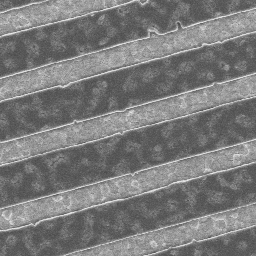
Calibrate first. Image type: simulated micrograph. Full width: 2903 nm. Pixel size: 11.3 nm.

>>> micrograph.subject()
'one or a few lines or trenches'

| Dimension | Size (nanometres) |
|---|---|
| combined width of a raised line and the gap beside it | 709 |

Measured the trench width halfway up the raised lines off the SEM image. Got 243 nanometres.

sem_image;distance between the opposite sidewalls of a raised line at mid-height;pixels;40.4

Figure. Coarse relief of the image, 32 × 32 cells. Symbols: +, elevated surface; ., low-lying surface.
++++...........+++++++++++++++++
+...........++++++++++++++++++..
........++++++++++++++++++......
....++++++++++++++++++..........
+++++++++++++++++++...........++
+++++++++++++++...........++++++
++++++++++++..........++++++++++
++++++++...........+++++++++++++
+++++..........+++++++++++++++++
+...........+++++++++++++++++++.
.........++++++++++++++++++.....
....++++++++++++++++++++........
++++++++++++++++++++..........++
++++++++++++++++...........+++++
+++++++++++++..........+++++++++
+++++++++..........+++++++++++++
+++++..........+++++++++++++++++
++..........++++++++++++++++++++
........++++++++++++++++++++....
....++++++++++++++++++++........
.++++++++++++++++++++..........+
+++++++++++++++++..........+++++
+++++++++++++..........+++++++++
++++++++++..........++++++++++++
++++++...........+++++++++++++++
++...........+++++++++++++++++++
.........+++++++++++++++++++....
.....+++++++++++++++++++........
..++++++++++++++++++...........+
+++++++++++++++++..........+++++
+++++++++++++..........+++++++++
+++++++++...........++++++++++++